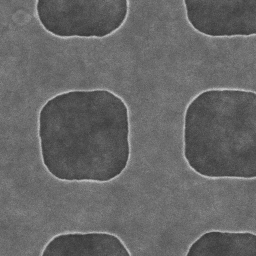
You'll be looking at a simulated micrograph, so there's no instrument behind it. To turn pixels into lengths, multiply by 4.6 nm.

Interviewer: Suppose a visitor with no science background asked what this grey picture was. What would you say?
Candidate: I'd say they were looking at holes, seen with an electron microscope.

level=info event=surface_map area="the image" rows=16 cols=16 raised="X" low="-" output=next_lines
XX------XXXX----
XXX-----XXXX----
XXXXXXXXXXXXXXXX
XXXXXXXXXXXXXXXX
XXXXXXXXXXXXXXXX
XXXXXXXXXXXXXXXX
XXX-----XXXX----
XX------XXXX----
XX------XXX-----
XXX-----XXXX----
XXX-----XXXX----
XXXXXXXXXXXXXXXX
XXXXXXXXXXXXXXXX
XXXXXXXXXXXXXXXX
XXXXXXXXXXXXX-XX
XXX-----XXXX----